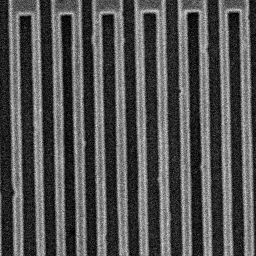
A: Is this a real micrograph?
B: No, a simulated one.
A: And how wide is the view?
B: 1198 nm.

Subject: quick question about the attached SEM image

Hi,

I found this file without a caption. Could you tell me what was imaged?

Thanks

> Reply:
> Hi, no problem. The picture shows parallel lines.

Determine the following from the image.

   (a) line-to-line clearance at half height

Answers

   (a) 58.4 nanometers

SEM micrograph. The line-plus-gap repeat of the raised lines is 98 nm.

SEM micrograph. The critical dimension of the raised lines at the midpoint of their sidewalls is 40.3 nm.